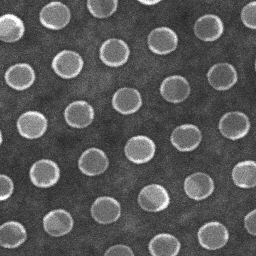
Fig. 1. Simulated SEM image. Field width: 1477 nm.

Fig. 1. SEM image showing a regular array of raised bodies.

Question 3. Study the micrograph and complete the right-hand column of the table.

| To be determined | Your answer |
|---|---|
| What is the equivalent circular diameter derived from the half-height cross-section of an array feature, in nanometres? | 161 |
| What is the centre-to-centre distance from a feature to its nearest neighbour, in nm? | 279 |